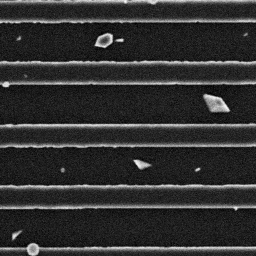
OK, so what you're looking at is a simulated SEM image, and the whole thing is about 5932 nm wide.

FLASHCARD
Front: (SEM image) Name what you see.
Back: lines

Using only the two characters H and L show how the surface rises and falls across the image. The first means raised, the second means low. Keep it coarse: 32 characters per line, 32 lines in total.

HHHHHHHHHHHHHHHHHHHHHHHHHHHHHHHH
HHHHHHHHHHHHHHHHHHHHHHHHHHHHHHHH
HHHHHHHHHHHHHHHHHHHHHHHHHHHHHHHH
LLLLLLLLLLLLLLLLLLLLLLLLLLLLLLLL
LLLLLLLLLLLLLHLLLLLLLLLLLLLLLLLL
LLLLLLLLLLLLHHLLLLLLLLLLLLLLLLLL
LLLLLLLLLLLLLLLLLLLLLLLLLLLLLLLL
LLLLLLLLLLLLLLLLLLLLLLLLLLLLLLLL
HHHHHHHHHHHHHHHHHHHHHHHHHHHHHHHH
HHHHHHHHHHHHHHHHHHHHHHHHHHHHHHHH
HHLLLLLLLLLLLLLLLLLLLLLLLLLLLLLL
LLLLLLLLLLLLLLLLLLLLLLLLLLLLLLLL
LLLLLLLLLLLLLLLLLLLLLLLLLLHHLLLL
LLLLLLLLLLLLLLLLLLLLLLLLLLHHLLLL
LLLLLLLLLLLLLLLLLLLLLLLLLLLLLLLL
LLLLLLLLLLLLLLLLLLLLLLLLLLLLLLLL
HHHHHHHHHHHHHHHHHHHHHHHHHHHHHHHH
HHHHHHHHHHHHHHHHHHHHHHHHHHHHHHHH
LLLLLLLLLLLLLLLLLLLLLLLLLLLLLLLL
LLLLLLLLLLLLLLLLLLLLLLLLLLLLLLLL
LLLLLLLLLLLLLLLLLHLLLLLLLLLLLLLL
LLLLLLLLLLLLLLLLLLLLLLLLLLLLLLLL
LLLLLLLLLLLLLLLLLLLLLLLLLLLLLLLL
HHHHHHHHHHHHHHHHHHHHHHHHHHHHHHHH
HHHHHHHHHHHHHHHHHHHHHHHHHHHHHHHH
HHHHHHHHHHHHHHHHHHHHHHHHHHHHHHHH
LLLLLLLLLLLLLLLLLLLLLLLLLLLLLLLL
LLLLLLLLLLLLLLLLLLLLLLLLLLLLLLLL
LLLLLLLLLLLLLLLLLLLLLLLLLLLLLLLL
LLLLLLLLLLLLLLLLLLLLLLLLLLLLLLLL
LLLLLLLLLLLLLLLLLLLLLLLLLLLLLLLL
HHHHHHHHHHHHHHHHHHHHHHHHHHHHHHHH